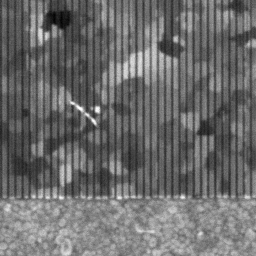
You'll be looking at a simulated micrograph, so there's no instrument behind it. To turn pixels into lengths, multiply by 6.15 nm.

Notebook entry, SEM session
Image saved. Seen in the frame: parallel lines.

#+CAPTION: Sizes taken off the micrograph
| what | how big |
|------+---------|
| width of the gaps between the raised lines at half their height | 23.8 nanometres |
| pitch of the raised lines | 43.8 nanometres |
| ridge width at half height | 18.4 nm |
